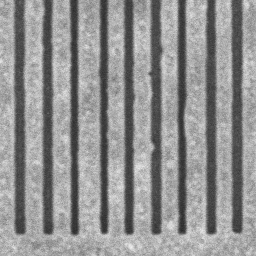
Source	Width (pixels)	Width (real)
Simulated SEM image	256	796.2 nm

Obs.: parallel lines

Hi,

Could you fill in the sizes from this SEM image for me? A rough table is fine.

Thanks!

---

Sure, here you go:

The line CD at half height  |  56.4 nanometers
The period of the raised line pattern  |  0.0844 um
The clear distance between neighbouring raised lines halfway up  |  28 nanometres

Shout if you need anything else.